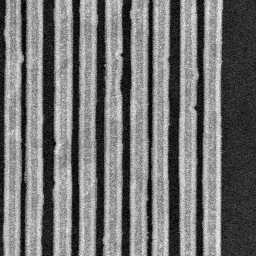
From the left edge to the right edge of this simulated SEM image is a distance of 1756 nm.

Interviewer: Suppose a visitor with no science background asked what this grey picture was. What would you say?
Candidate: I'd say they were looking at parallel lines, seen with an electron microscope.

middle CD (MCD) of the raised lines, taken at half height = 76.3 nm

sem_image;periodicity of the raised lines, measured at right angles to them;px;24.9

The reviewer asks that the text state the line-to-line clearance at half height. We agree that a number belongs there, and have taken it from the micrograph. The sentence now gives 93.4 nanometres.